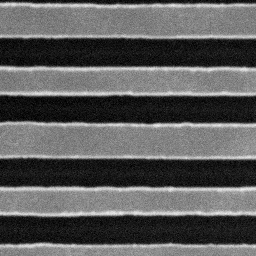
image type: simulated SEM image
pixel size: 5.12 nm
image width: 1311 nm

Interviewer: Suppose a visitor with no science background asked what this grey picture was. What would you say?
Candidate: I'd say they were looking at lines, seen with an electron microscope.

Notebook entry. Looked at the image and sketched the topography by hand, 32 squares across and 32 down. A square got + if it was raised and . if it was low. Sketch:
++++............................
++++++++++++++++++++++++++++++++
++++++++++++++++++++++++++++++++
++++++++++++++++++++++++++++++++
++++++++++++++++++++++++++++++++
................................
................................
................................
++++++++++++++++++++++++++.++...
++++++++++++++++++++++++++++++++
++++++++++++++++++++++++++++++++
++++++++++++++++++++++++++++++++
................................
................................
................................
+++++++++++............+........
++++++++++++++++++++++++++++++++
++++++++++++++++++++++++++++++++
++++++++++++++++++++++++++++++++
++++++++++++++++++++++++++++++++
................................
................................
................................
..++++.+.........+..............
++++++++++++++++++++++++++++++++
++++++++++++++++++++++++++++++++
++++++++++++++++++++++++++++++++
................................
................................
................................
....+++.........................
++++++++++++++++++++++++++++++++